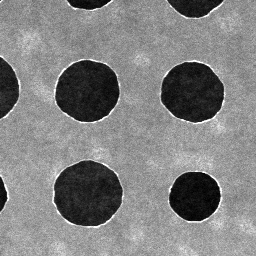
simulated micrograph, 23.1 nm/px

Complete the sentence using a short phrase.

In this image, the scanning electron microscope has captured holes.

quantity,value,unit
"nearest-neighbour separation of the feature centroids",2380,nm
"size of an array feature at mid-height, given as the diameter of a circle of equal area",1.45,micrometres